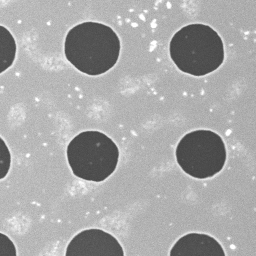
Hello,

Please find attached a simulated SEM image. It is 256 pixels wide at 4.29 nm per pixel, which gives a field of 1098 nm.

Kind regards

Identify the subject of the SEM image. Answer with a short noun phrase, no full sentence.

holes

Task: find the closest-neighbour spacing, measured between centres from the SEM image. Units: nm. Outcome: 448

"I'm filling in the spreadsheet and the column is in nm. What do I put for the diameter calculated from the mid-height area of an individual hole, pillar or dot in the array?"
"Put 224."